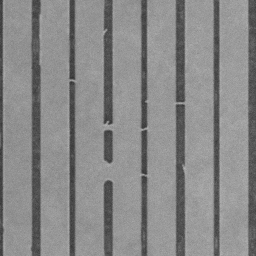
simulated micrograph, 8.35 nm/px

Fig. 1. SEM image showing parallel lines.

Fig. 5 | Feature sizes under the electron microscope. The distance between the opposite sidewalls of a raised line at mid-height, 236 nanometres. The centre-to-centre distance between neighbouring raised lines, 302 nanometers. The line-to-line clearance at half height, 59.5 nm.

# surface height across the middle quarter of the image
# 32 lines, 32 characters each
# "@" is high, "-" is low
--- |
@--@@@@@@@--@@@@@@@--@@@@@@@--@@
@--@@@@@@@--@@@@@@@--@@@@@@@--@@
@--@@@@@@@--@@@@@@@--@@@@@@@--@@
@--@@@@@@@--@@@@@@@--@@@@@@@--@@
@--@@@@@@@--@@@@@@@--@@@@@@@--@@
@--@@@@@@@--@@@@@@@--@@@@@@@--@@
@--@@@@@@@--@@@@@@@--@@@@@@@--@@
@--@@@@@@@--@@@@@@@--@@@@@@@--@@
@--@@@@@@@--@@@@@@@--@@@@@@@--@@
@--@@@@@@@--@@@@@@@--@@@@@@@--@@
@--@@@@@@@--@@@@@@@--@@@@@@@--@@
@--@@@@@@@--@@@@@@@--@@@@@@@--@@
@--@@@@@@@--@@@@@@@--@@@@@@@--@@
@--@@@@@@@--@@@@@@@--@@@@@@@--@@
@--@@@@@@@--@@@@@@@--@@@@@@@--@@
@--@@@@@@@@@@@@@@@@--@@@@@@@--@@
@--@@@@@@@--@@@@@@@@-@@@@@@@--@@
@--@@@@@@@--@@@@@@@--@@@@@@@--@@
@--@@@@@@@--@@@@@@@--@@@@@@@--@@
@--@@@@@@@--@@@@@@@--@@@@@@@--@@
@--@@@@@@@--@@@@@@@--@@@@@@@--@@
@--@@@@@@@--@@@@@@@--@@@@@@@--@@
@--@@@@@@@--@@@@@@@--@@@@@@@--@@
@--@@@@@@@--@@@@@@@--@@@@@@@--@@
@--@@@@@@@@-@@@@@@@--@@@@@@@--@@
@--@@@@@@@@@@@@@@@@--@@@@@@@--@@
@--@@@@@@@@@@@@@@@@--@@@@@@@--@@
@--@@@@@@@@@@@@@@@@@-@@@@@@@--@@
@--@@@@@@@@@@@@@@@@--@@@@@@@--@@
@--@@@@@@@--@@@@@@@--@@@@@@@--@@
@--@@@@@@@--@@@@@@@--@@@@@@@--@@
@--@@@@@@@--@@@@@@@--@@@@@@@--@@